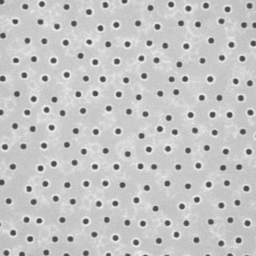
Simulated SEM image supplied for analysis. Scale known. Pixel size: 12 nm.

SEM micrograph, a regular array of holes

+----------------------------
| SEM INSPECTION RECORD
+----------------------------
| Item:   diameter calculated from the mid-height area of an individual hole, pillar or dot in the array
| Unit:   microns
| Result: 0.0815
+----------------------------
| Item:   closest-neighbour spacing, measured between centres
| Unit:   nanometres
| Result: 204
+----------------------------